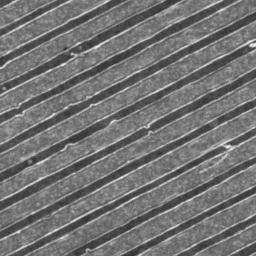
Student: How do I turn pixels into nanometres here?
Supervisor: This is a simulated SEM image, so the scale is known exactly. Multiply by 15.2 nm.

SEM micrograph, parallel lines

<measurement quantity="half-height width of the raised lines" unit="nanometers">140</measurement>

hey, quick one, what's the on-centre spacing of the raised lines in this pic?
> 25.7 px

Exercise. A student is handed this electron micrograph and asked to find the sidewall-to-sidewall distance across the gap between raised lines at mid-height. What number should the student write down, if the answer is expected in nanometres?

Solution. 246